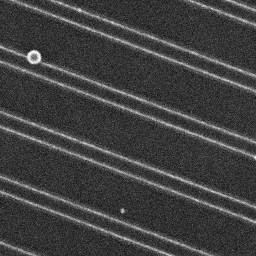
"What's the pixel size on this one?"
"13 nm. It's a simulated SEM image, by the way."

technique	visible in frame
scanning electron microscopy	lines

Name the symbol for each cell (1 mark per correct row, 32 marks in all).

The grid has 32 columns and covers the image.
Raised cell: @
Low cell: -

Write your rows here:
---@@@@@-----------------@@@@@--
-----@@@@@@-----------------@@@@
--------@@@@@-----------------@@
-----------@@@@@----------------
-------------@@@@@@-------------
----------------@@@@@-----------
@@--@--------------@@@@@--------
@@@@@----------------@@@@@@-----
--@@@@@-----------------@@@@@---
-----@@@@@-----------------@@@@@
-------@@@@@@----------------@@@
----------@@@@@-----------------
-------------@@@@@--------------
---------------@@@@@@-----------
@-----------------@@@@@---------
@@@@-----------------@@@@@------
--@@@@@----------------@@@@@@---
----@@@@@@----------------@@@@@-
-------@@@@@-----------------@@@
----------@@@@@----------------@
------------@@@@@@--------------
---------------@@@@@------------
@-----------------@@@@@---------
@@@@----------------@@@@@@------
-@@@@@@----------------@@@@@----
----@@@@@-----------------@@@@@-
-------@@@@@----------------@@@@
---------@@@@@@----------------@
------------@@@@@---------------
---------------@@@@@------------
@----------------@@@@@@---------
@@@-----------------@@@@@-------